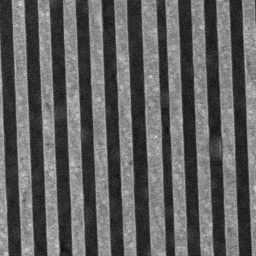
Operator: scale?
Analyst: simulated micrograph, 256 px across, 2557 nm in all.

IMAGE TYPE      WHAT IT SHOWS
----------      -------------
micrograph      parallel lines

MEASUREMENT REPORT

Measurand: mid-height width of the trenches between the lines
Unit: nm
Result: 136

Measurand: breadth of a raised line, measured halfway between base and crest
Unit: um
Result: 0.117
